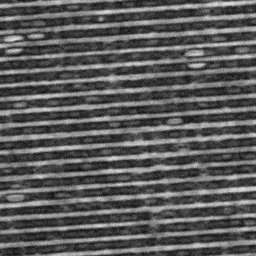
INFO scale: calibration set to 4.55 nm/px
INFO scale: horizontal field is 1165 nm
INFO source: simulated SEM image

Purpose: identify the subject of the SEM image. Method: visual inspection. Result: parallel lines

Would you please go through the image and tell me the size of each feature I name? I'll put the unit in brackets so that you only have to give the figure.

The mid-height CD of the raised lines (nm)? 16.5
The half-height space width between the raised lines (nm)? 44.9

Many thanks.